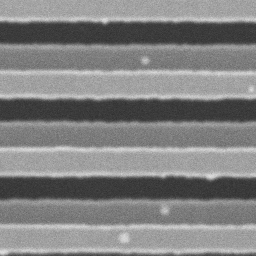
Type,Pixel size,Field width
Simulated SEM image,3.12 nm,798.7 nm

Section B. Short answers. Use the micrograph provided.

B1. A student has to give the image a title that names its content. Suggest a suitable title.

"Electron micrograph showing lines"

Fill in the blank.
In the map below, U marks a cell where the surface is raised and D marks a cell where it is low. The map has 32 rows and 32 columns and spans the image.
UUUUUUUUUUUUUUUUUUUUUUUUUUUUUUUU
UUUUUUUUUUUUUUUUUUUUUUUUUUUUUUUU
UUUUDUDUUUDUUUDUUUUUUUUDUUUUUUUU
DDDDDDDDDDDDDDDDDDDDDDDDDDDDDDDD
DDDDDDDDDDDDDDDDDDDDDDDDDDDDDDDD
DDDDDDDDDDDDDDDDDDDDDDDDDDDDDDDD
UUUUUUUUUUUUUUUUUUUUUUUUUUUUUUUU
UUUUUUUUUUUUUUUUUUUUUUUUUUUUUUUU
UUUUUUUUUUUUUUUUUUUUUUUUUUUUUUUU
UUUUUUUUUUUUUUUUUUUUUUUUUUUUUUUU
UUUUUUUUUUUUUUUUUUUUUUUUUUUUUUUU
UUUUUUUUUUUUUUUUUUUUUUUUUUUUUUUU
DDDDDDDDDDDDDDDDDDDDDDDDDDDDDDDD
DDDDDDDDDDDDDDDDDDDDDDDDDDDDDDDD
DDDDDDDDDDDDDDDDDDDDDDDDDDDDDDDD
UUUUUUUUUUUUUUUUUUUUUUUUUUUUUUUU
UUUUUUUUUUUUUUUUUUUUUUUUUUUUUUUU
UUUUUUUUUUUUUUUUUUUUUUUUUUUUUUUU
UUUUUUUUUUUUUUUUUUUUUUUUUUUUUUUU
UUUUUUUUUUUUUUUUUUUUUUUUUUUUUUUU
UUUUUUUUUUUUUUUUUUUUUUUUUUUUUUUU
UUUUUUUUUUUUUUUUUUUUUUUUUUUUUUUU
DDDDDDDDDDDDDDDDDDDDDDDDDDDDDDDD
DDDDDDDDDDDDDDDDDDDDDDDDDDDDDDDD
DDDDDDDDDDDDDDDDDDDDDDDDDDDDDDDD
UUUUUUUUUUUUUUUUUUUUUUUUUUUUUUUU
UUUUUUUUUUUUUUUUUUUUUUUUUUUUUUUU
UUUUUUUUUUUUUUUUUUUUUUUUUUUUUUUU
UUUUUUUUUUUUUUUUUUUUUUUUUUUUUUUU
UUUUUUUUUUUUUUUUUUUUUUUUUUUUUUUU
UUUUUUUUUUUUUUUUUUUUUUUUUUUUUUUU
UUUUUUDDUDDDDDDUUUUUUUUUUUUUUUUU